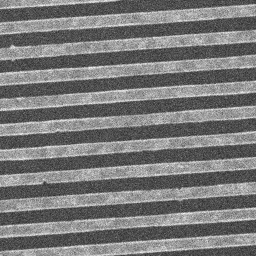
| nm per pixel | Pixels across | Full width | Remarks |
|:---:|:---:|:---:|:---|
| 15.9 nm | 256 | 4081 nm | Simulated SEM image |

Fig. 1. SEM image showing parallel lines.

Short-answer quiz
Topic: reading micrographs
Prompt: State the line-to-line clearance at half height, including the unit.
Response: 238 nanometers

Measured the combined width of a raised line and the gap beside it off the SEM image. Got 25.3 px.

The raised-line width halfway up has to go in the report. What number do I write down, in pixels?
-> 10.5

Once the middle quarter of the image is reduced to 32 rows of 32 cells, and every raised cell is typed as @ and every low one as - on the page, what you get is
---------------@@@@@@@@@@@@@@@@@
@@@@@@@@@@@@@@@@@@@@@@@@@@@@@@@@
@@@@@@@@@@@@@@@@@@@@@-----------
@@@@@@@-------------------------
--------------------------------
-------------------------------@
-----------------@@@@@@@@@@@@@@@
------@@@@@@@@@@@@@@@@@@@@@@@@@@
@@@@@@@@@@@@@@@@@@@@@@@---------
@@@@@@@@@-----------------------
--------------------------------
--------------------------------
-------------------------@@@@@@@
-----------@@@@@@@@@@@@@@@@@@@@@
@@@@@@@@@@@@@@@@@@@@@@@@@@@@@---
@@@@@@@@@@@@@@@-----------------
@@@@----------------------------
--------------------------------
-------------------------------@
-----------------@@@@@@@@@@@@@@@
@@@@@@@@@@@@@@@@@@@@@@@@@@@@@@@@
@@@@@@@@@@@@@@@@@@@@------------
@@@@@@--------------------------
--------------------------------
--------------------------------
-------------------@@@@@@@@@@@@@
-----@@@@@@@@@@@@@@@@@@@@@@@@@@@
@@@@@@@@@@@@@@@@@@@@@@@@@-------
@@@@@@@@@@@---------------------
--------------------------------
--------------------------------
------------------------@@@@@@@@